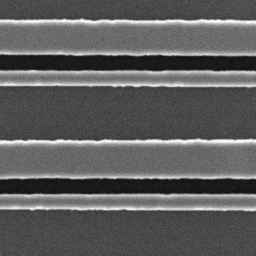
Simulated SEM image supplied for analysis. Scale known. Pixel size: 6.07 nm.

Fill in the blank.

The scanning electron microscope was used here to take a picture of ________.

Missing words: lines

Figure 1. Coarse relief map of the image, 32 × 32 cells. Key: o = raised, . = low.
................................
................................
................................
oooooooooooooooooooooooooooooooo
oooooooooooooooooooooooooooooooo
oooooooooooooooooooooooooooooooo
oooooooooooooooooooooooooooooooo
................................
................................
oooooooooooooooooooooooooooooooo
oooooooooooooooooooooooooooooooo
................................
................................
................................
................................
................................
................................
................................
oooooooooooooooooooooooooooooooo
oooooooooooooooooooooooooooooooo
oooooooooooooooooooooooooooooooo
oooooooooooooooooooooooooooooooo
................................
................................
oooooooooooooooooooooooooooooooo
oooooooooooooooooooooooooooooooo
................................
................................
................................
................................
................................
................................